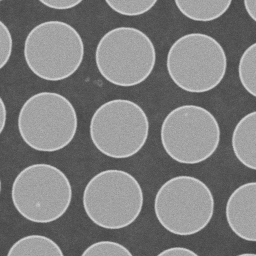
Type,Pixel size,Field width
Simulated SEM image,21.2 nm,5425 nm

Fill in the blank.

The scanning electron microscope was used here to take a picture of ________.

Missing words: an array of small figures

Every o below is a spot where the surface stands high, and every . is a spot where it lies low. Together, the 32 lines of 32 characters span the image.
......oooo....ooooo...ooooooo..o
...............ooo.....ooooo...o
.........................o......
o...ooooo......o................
o...oooooo...ooooo.....ooo......
o..ooooooo..ooooooo...ooooo.....
o..ooooooo..ooooooo..ooooooo...o
o..ooooooo..ooooooo..ooooooo..oo
....oooooo..ooooooo..ooooooo..oo
.....oooo....ooooo...ooooooo..oo
...............oo.....ooooo...oo
...............................o
....oooo........................
o..oooooo...ooooo.....ooo.......
o.ooooooo...oooooo...oooooo....o
o.oooooooo.ooooooo..ooooooo...oo
...oooooo..ooooooo..ooooooo..ooo
...oooooo...oooooo..ooooooo..ooo
....oooo....oooooo...oooooo..ooo
..............oo.....ooooo....oo
..............................oo
...ooooo.....oo.................
..oooooo...oooooo....oooo.......
..ooooooo..ooooooo..oooooo....oo
..ooooooo.oooooooo..oooooo...ooo
..ooooooo.oooooooo.oooooooo.oooo
..oooooo...oooooo..oooooooo.oooo
....ooo....oooooo...oooooo..oooo
..............o......oooo....ooo
....o.........................oo
..ooooo.....ooo.................
.ooooooo...ooooo....oooo........